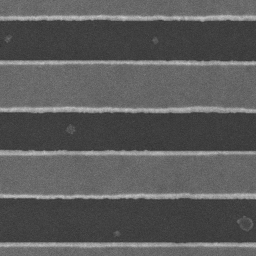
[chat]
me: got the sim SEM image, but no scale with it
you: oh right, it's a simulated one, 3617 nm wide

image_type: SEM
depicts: lines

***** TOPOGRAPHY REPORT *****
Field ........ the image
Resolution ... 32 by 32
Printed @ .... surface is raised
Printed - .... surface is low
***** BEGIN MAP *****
@@@@@@@@@@@@@@@@@@@@@@@@@@@@@@@@
@@@@@@@@@@@@@@@@@@@@@@@@@@@@@@@@
-------------------------@------
--------------------------------
--------------------------------
--------------------------------
--------------------------------
--------------------------------
@@@@@@@@@@@@@@@@@@@@@@@@@@@@@@@@
@@@@@@@@@@@@@@@@@@@@@@@@@@@@@@@@
@@@@@@@@@@@@@@@@@@@@@@@@@@@@@@@@
@@@@@@@@@@@@@@@@@@@@@@@@@@@@@@@@
@@@@@@@@@@@@@@@@@@@@@@@@@@@@@@@@
@@@@@@@@@@@@@@@@@@@@@@@@@@@@@@@@
--------------------------------
--------------------------------
--------------------------------
--------------------------------
--------------------------------
@@@@@@@@@@@@@@@@@@@@@@@@@@@@@@@@
@@@@@@@@@@@@@@@@@@@@@@@@@@@@@@@@
@@@@@@@@@@@@@@@@@@@@@@@@@@@@@@@@
@@@@@@@@@@@@@@@@@@@@@@@@@@@@@@@@
@@@@@@@@@@@@@@@@@@@@@@@@@@@@@@@@
@@@@@@@@@@@@@@@@@@@@@@@@@@@@@@@@
--------------------------------
--------------------------------
--------------------------------
--------------------------------
--------------------------------
@@@@@@@@@@@@@@@@@@@@@@@@@@@@@@@@
@@@@@@@@@@@@@@@@@@@@@@@@@@@@@@@@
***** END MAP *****